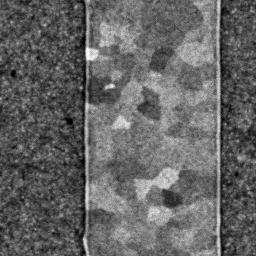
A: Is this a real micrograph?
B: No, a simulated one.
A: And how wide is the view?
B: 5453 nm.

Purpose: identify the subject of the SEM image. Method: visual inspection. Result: one or a few lines or trenches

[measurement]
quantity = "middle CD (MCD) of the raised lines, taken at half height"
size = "132 pixels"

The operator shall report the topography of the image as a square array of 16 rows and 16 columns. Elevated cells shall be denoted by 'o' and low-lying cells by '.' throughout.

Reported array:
.....ooooooooo..
......oooooooo..
.....ooooooooo..
......oooooooo..
.....ooooooooo..
.....ooooooooo..
.....ooooooooo..
.....ooooooooo..
.....ooooooooo..
.....ooooooooo..
.....ooooooooo..
.....ooooooooo..
.....ooooooooo..
.....ooooooooo..
.....ooooooooo..
.....ooooooooo..